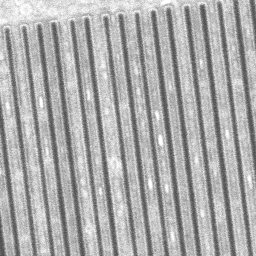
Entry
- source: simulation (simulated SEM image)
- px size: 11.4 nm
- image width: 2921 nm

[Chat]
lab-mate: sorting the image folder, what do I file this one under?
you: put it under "parallel lines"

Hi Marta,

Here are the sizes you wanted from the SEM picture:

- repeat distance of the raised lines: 16.5 pixels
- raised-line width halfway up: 89.2 nanometers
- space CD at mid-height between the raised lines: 89.2 nanometers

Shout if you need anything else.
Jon